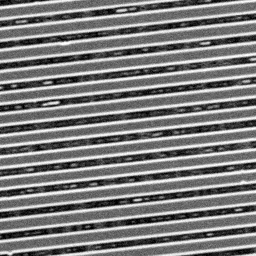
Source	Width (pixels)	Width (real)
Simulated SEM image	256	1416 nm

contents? parallel lines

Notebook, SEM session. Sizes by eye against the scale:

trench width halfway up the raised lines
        48.7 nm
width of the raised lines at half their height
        0.0687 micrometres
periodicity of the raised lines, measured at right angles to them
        0.117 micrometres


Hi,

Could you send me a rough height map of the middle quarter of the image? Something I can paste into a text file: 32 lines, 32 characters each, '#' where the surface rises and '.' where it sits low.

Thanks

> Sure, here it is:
######################..........
#############...................
####......................######
.................###############
........########################
#########################.......
################................
#######....................#####
..................##############
...........#####################
..##########################....
###################.............
##########......................
#......................#########
..............##################
.....##########################.
######################..........
#############...................
####......................######
.................###############
........########################
#########################.......
################................
#######.....................####
....................############
...........#####################
..##########################....
###################.............
##########.....................#
#......................#########
..............##################
.....##########################.